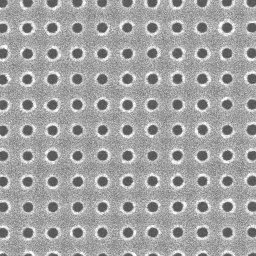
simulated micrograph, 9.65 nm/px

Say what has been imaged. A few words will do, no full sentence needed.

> a regular array of holes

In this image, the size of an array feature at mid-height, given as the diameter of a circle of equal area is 98.6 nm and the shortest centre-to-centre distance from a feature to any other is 0.239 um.